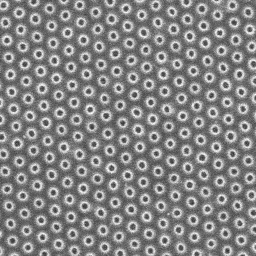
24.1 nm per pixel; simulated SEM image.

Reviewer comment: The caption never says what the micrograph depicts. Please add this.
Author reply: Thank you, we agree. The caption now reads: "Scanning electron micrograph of a regular array of holes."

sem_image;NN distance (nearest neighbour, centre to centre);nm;409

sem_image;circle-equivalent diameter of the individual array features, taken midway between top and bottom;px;6.68